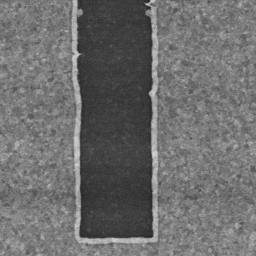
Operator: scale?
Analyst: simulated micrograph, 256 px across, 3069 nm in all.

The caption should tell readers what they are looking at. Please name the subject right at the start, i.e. one or a few lines or trenches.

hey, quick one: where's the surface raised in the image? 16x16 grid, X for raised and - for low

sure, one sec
XXXXX----XXXXXXX
XXXXX-----XXXXXX
XXXXX-----XXXXXX
XXXXX-----XXXXXX
XXXXX-----XXXXXX
XXXXX-----XXXXXX
XXXXX-----XXXXXX
XXXXX-----XXXXXX
XXXXX-----XXXXXX
XXXXX-----XXXXXX
XXXXX-----XXXXXX
XXXXX-----XXXXXX
XXXXX-----XXXXXX
XXXXX-----XXXXXX
XXXXX-----XXXXXX
XXXXXXXXXXXXXXXX